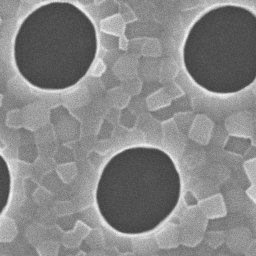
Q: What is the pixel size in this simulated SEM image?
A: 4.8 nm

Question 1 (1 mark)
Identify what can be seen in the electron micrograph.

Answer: holes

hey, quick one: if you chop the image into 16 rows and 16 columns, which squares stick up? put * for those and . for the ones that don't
**...********..*
*.....******....
*.....******....
*.....*****.....
*....*******....
**..*********..*
****************
****************
****************
********..******
*******....*****
.*****.....*****
.*****.....*****
******.....*****
*******..*******
****************